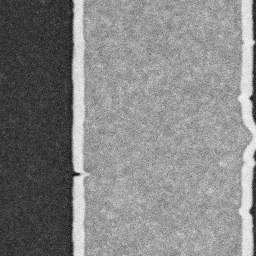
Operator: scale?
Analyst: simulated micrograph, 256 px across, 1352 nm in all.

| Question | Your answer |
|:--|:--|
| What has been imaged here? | one or a few lines or trenches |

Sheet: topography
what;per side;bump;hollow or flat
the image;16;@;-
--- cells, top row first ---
-----@@@@@@@@@@-
-----@@@@@@@@@@-
-----@@@@@@@@@@-
-----@@@@@@@@@@-
-----@@@@@@@@@@-
-----@@@@@@@@@@-
-----@@@@@@@@@@-
-----@@@@@@@@@@@
-----@@@@@@@@@@@
-----@@@@@@@@@@@
-----@@@@@@@@@@@
-----@@@@@@@@@@-
-----@@@@@@@@@@-
-----@@@@@@@@@@-
-----@@@@@@@@@@-
-----@@@@@@@@@@-